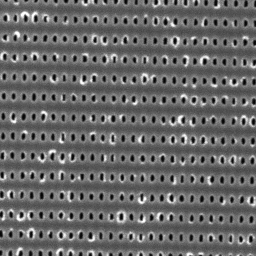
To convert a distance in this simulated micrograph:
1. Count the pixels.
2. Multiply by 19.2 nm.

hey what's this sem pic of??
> a regular array of holes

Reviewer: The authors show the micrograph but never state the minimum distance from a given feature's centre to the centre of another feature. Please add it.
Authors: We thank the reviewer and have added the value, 189 nm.